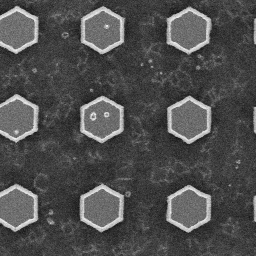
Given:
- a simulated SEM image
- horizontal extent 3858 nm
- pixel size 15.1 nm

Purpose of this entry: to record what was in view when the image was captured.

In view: raised bodies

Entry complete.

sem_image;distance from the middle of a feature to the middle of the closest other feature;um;1.31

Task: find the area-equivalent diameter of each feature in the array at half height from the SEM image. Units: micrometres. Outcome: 0.618